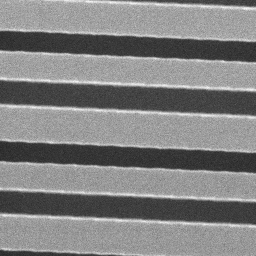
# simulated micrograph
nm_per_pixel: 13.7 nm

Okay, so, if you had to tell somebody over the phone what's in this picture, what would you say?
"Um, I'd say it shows lines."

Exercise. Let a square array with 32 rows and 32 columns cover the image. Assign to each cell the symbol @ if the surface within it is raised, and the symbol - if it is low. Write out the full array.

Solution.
@@@@@@@@@@@@@@@@@@@@------------
@@@@@@@@@@@@@@@@@@@@@@@@@@@@@@@@
@@@@@@@@@@@@@@@@@@@@@@@@@@@@@@@@
@@@@@@@@@@@@@@@@@@@@@@@@@@@@@@@@
-----------------@@@@@@@@@@@@@@@
--------------------------------
@-------------------------------
@@@@@@@@@@@@@@@@@@@@@@@---------
@@@@@@@@@@@@@@@@@@@@@@@@@@@@@@@@
@@@@@@@@@@@@@@@@@@@@@@@@@@@@@@@@
------------@@@@@@@@@@@@@@@@@@@@
--------------------------------
--------------------------------
@@@@@@@-------------------------
@@@@@@@@@@@@@@@@@@@@@@@@@@@@@---
@@@@@@@@@@@@@@@@@@@@@@@@@@@@@@@@
@@@@@@@@@@@@@@@@@@@@@@@@@@@@@@@@
@@@@@@@@@@@@@@@@@@@@@@@@@@@@@@@@
-------------------@@@@@@@@@@@@@
--------------------------------
@@@@@---------------------------
@@@@@@@@@@@@@@@@@@@@@@@@@@@-----
@@@@@@@@@@@@@@@@@@@@@@@@@@@@@@@@
@@@@@@@@@@@@@@@@@@@@@@@@@@@@@@@@
----------------@@@@@@@@@@@@@@@@
--------------------------------
--------------------------------
@@@@@@@@@@@@@@@-----------------
@@@@@@@@@@@@@@@@@@@@@@@@@@@@@@@@
@@@@@@@@@@@@@@@@@@@@@@@@@@@@@@@@
@@@@@@@@@@@@@@@@@@@@@@@@@@@@@@@@
-------@@@@@@@@@@@@@@@@@@@@@@@@@